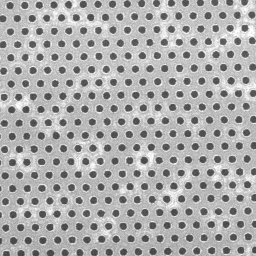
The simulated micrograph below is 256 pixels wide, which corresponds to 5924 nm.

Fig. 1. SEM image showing a regular array of holes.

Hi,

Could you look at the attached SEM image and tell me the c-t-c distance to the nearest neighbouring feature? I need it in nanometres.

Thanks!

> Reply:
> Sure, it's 336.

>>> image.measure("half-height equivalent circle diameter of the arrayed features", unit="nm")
188